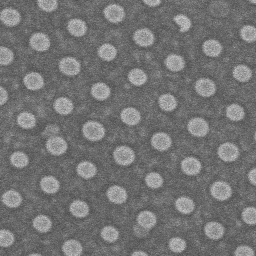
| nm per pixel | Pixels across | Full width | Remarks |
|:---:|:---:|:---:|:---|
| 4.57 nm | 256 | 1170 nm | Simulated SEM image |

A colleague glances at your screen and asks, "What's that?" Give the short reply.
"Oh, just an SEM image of a regular array of raised bodies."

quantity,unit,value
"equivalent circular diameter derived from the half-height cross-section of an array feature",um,0.079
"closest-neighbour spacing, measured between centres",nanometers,178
